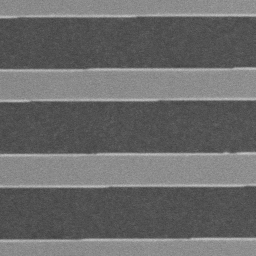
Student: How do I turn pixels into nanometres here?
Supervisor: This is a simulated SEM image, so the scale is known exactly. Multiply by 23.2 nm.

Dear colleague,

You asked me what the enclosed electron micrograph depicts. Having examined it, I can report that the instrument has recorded lines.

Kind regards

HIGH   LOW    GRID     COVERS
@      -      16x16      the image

@@@@@@@@@@@@@@@@
----------------
----------------
----------------
@@@@@@@@@@@@@@@@
@@@@@@@@@@@@@@@@
----------------
----------------
----------------
----------------
@@@@@@@@@@@@@@@@
@@@@@@@@@@@@@@@@
----------------
----------------
----------------
@@@@@@@@@@@@@@@@